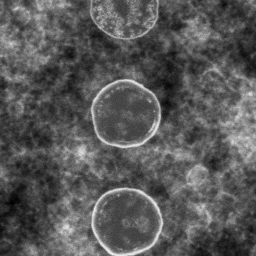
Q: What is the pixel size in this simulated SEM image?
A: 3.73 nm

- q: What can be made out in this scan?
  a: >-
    raised bodies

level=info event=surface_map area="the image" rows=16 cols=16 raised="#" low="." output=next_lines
................
................
................
................
................
.......##.......
......####......
......####......
......###.......
................
................
................
......###.......
......####......
......####......
.......##.......